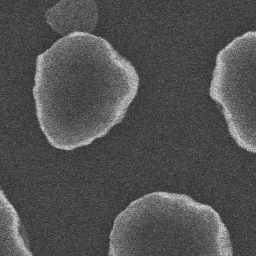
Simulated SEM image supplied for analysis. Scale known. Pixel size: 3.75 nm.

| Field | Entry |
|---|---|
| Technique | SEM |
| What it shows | raised bodies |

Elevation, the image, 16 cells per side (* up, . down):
................
................
....**.........*
...****.......**
..******......**
..******.....***
..******......**
..*****.......**
...***.........*
................
................
................
.........***....
*......*******..
*......*******..
**.....*******..